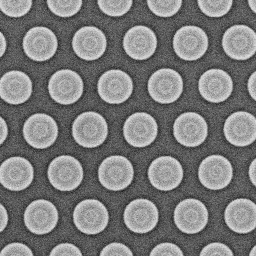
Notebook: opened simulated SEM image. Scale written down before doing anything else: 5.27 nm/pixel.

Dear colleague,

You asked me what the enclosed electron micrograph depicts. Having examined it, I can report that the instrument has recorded an array of small figures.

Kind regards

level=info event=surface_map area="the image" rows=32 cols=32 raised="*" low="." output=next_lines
****..****..****..*****..****..*
***....***...***...***...***....
................................
....**....**.....*.....**....**.
...****..****...***...****..****
*..****..****..*****..****..****
...****..****...***...****..****
....**.................*........
................................
***....***...***...***...****..*
****..****..*****..****..****..*
****..****..****...****..****..*
.**....***...***...***....**....
................................
....**....***...***...***....***
*..****..****...****..****..****
*..****..****..*****..****..****
*..****..****...***...***....***
.....*..........................
..............*...........**....
****..****...***...***...****..*
****..****..*****..****..****..*
****..****..****...****..****..*
.**....**....***....**....**....
................................
....**....***...***...***....***
*..****..****...****..****..****
*..****..*****..****..****..****
...****...***...***...***....***
................................
.**.....*.....*.....**....**....
****..****...***...****..****..*